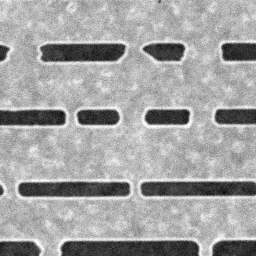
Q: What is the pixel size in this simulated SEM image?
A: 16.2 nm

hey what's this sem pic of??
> one or a few lines or trenches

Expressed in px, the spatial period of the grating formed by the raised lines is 66.6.